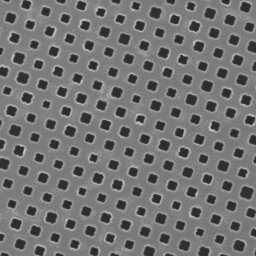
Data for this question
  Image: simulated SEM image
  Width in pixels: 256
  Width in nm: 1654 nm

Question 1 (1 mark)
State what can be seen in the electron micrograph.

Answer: a regular array of holes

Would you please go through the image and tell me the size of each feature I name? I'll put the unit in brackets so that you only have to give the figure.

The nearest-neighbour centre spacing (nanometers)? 130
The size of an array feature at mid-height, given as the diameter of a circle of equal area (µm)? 0.0588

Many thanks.